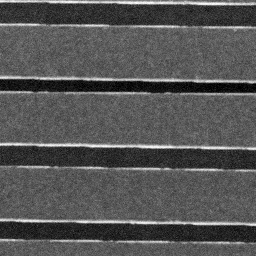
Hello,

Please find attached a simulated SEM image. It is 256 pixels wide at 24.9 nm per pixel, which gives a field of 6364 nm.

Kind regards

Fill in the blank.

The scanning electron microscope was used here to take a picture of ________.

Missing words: lines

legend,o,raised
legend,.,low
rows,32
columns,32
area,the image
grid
.........................ooooooo
................................
................................
oooooooooooooooooooooooooooooooo
oooooooooooooooooooooooooooooooo
oooooooooooooooooooooooooooooooo
oooooooooooooooooooooooooooooooo
oooooooooooooooooooooooooooooooo
oooooooooooooooooooooooooooooooo
oooooooooooooooooooooooooooooooo
................................
................................
oooooooooooooooooooooooooooooooo
oooooooooooooooooooooooooooooooo
oooooooooooooooooooooooooooooooo
oooooooooooooooooooooooooooooooo
oooooooooooooooooooooooooooooooo
oooooooooooooooooooooooooooooooo
.........................ooooooo
................................
................................
oooooooooooooooooooooooooooooooo
oooooooooooooooooooooooooooooooo
oooooooooooooooooooooooooooooooo
oooooooooooooooooooooooooooooooo
oooooooooooooooooooooooooooooooo
oooooooooooooooooooooooooooooooo
oooooooooooooooooooooooooooooooo
................................
................................
oooooooooooooooooooooooooooooooo
oooooooooooooooooooooooooooooooo